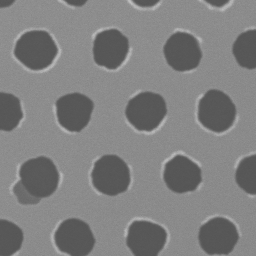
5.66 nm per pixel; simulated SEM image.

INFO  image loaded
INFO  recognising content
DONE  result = a regular array of holes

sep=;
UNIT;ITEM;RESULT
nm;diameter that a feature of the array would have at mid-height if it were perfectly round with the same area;223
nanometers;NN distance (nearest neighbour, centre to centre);404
